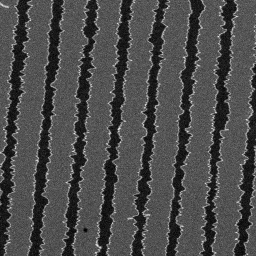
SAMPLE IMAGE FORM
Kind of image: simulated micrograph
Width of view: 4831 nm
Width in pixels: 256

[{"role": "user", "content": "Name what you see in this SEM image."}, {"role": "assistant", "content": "parallel lines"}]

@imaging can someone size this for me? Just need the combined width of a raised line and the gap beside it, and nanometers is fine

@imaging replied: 647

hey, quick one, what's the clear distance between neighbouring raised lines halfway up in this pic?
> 427 nanometers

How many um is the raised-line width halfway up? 0.214